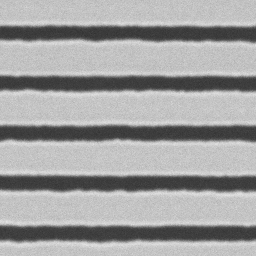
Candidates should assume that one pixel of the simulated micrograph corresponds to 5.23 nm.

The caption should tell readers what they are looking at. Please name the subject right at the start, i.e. lines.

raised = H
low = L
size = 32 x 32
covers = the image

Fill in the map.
HHHHHHHHHHHHHHHHHHHHHHHHHHHHHHHH
HHHHHHHHHHHHHHHHHHHHHHHHHHHHHHHH
HHHHHHHHHHHHHHHHHHHHHHHHHHHHHHHH
LLLLLLLLLLLLLLLLLLLLLLLLLLLLLLLL
LLLLLLLLLLLLLLLLLLLLLLLLLLLLLLLL
HHHHHHHHHHHHHHHHHHHHHHHHHHHHHHHH
HHHHHHHHHHHHHHHHHHHHHHHHHHHHHHHH
HHHHHHHHHHHHHHHHHHHHHHHHHHHHHHHH
HHHHHHHHHHHHHHHHHHHHHHHHHHHHHHHH
LLLLLLLLLLLLLLLLLLLLLLLLLLLLLLLL
LLLLLLLLLLLLLLLLLLLLLLLLLLLLLLLL
HHHHHHHHHLLHHHHHHHHHHHHHHHHHHHHH
HHHHHHHHHHHHHHHHHHHHHHHHHHHHHHHH
HHHHHHHHHHHHHHHHHHHHHHHHHHHHHHHH
HHHHHHHHHHHHHHHHHHHHHHHHHHHHHHHH
HHHHHHHHHHHHHHHHHHHHHHHHHHHHHHHH
LLLLLLLLLLLLLLLLLLLLLLLLLLLLLLLL
LHLLLLLLLLLLLLHLLLLLLLLLLLLLLLLL
HHHHHHHHHHHHHHHHHHHHHHHHHHHHHHHH
HHHHHHHHHHHHHHHHHHHHHHHHHHHHHHHH
HHHHHHHHHHHHHHHHHHHHHHHHHHHHHHHH
HHHHHHHHHHHHHHHHHHHHHHHHHHHHHHHH
LLLLLLLLLLLLLLLLLLLLLLLLLLLLLLLL
LLLLLLLLLLLLLLLLLLLLLLLLLLLLLLLL
HHHHHHHHHHHHHHHHHHHHHHHHHHHHHHHH
HHHHHHHHHHHHHHHHHHHHHHHHHHHHHHHH
HHHHHHHHHHHHHHHHHHHHHHHHHHHHHHHH
HHHHHHHHHHHHHHHHHHHHHHHHHHHHHHHH
LLLLLLLLLLLLLLLLLLLLLLLLLLLLLLLL
LLLLLLLLLLLLLLLLLLLLLLLLLLLLLLLL
HHHHHHHHHHHHHHHHHHHHHHHHHHHHHHHH
HHHHHHHHHHHHHHHHHHHHHHHHHHHHHHHH